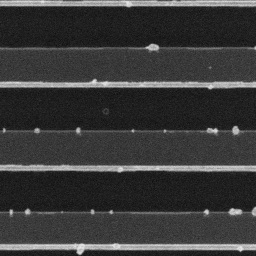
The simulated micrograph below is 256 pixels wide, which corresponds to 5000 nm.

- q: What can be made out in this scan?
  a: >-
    lines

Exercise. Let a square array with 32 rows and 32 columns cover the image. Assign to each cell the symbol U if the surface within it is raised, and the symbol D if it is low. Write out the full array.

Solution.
UUUUUUUUUUUUUUUUUUUUUUUUUUUUUUUU
DDDDDDDDDDDDDDDDDDDDDDDDDDDDDDDD
DDDDDDDDDDDDDDDDDDDDDDDDDDDDDDDD
DDDDDDDDDDDDDDDDDDDDDDDDDDDDDDDD
DDDDDDDDDDDDDDDDDDDDDDDDDDDDDDDD
DDDDDDDDDDDDDDDDDDDDDDDDDDDDDDDD
UUUUUUUUUUUUUUUUUUUUUUUUUUUUUUUU
UUUUUUUUUUUUUUUUUUUUUUUUUUUUUUUU
UUUUUUUUUUUUUUUUUUUUUUUUUUUUUUUU
UUUUUUUUUUUUUUUUUUUUUUUUUUUUUUUU
UUUUUUUUUUUUUUUUUUUUUUUUUUUUUUUU
DDDDDDDDDDDDDDDDDDDDDDDDDDDDDDDD
DDDDDDDDDDDDDDDDDDDDDDDDDDDDDDDD
DDDDDDDDDDDDDDDDDDDDDDDDDDDDDDDD
DDDDDDDDDDDDDDDDDDDDDDDDDDDDDDDD
DDDDDDDDDDDDDDDDDDDDDDDDDDDDDDDD
UUUUUUUUUUUUUUUUUUUUUUUUUUUUUUUU
UUUUUUUUUUUUUUUUUUUUUUUUUUUUUUUU
UUUUUUUUUUUUUUUUUUUUUUUUUUUUUUUU
UUUUUUUUUUUUUUUUUUUUUUUUUUUUUUUU
UUUUUUUUUUUUUUUUUUUUUUUUUUUUUUUU
DDDDDDDDDDDDDDDDDDDDDDDDDDDDDDDD
DDDDDDDDDDDDDDDDDDDDDDDDDDDDDDDD
DDDDDDDDDDDDDDDDDDDDDDDDDDDDDDDD
DDDDDDDDDDDDDDDDDDDDDDDDDDDDDDDD
DDDDDDDDDDDDDDDDDDDDDDDDDDDDDDDD
DUDUDDDUDDDUDUDDDDDDDDDDDUUDUUUU
UUUUUUUUUUUUUUUUUUUUUUUUUUUUUUUU
UUUUUUUUUUUUUUUUUUUUUUUUUUUUUUUU
UUUUUUUUUUUUUUUUUUUUUUUUUUUUUUUU
UUUUUUUUUUUUUUUUUUUUUUUUUUUUUUUU
DDDDDDDDDDDDDDDDDDDDDDDDDDDDDDDD